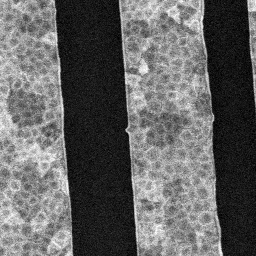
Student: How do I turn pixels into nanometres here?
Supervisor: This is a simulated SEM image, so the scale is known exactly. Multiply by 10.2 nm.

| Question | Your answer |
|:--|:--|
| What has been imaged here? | one or a few lines or trenches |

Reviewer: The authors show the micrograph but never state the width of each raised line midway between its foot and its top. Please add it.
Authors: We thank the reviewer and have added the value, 835 nanometers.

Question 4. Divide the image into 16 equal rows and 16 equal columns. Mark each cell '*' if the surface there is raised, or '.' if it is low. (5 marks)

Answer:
***....******...
***.....*****...
****....*****...
****....*****...
****....*****...
****....*****...
****....*****...
****....*****...
****....*****...
****....*****...
****....*****...
****....*****...
****....*****...
****....******..
****.....*****..
*****....*****..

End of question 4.